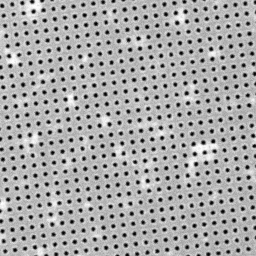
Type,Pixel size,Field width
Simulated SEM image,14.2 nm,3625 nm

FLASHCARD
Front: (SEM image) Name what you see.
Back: a regular array of holes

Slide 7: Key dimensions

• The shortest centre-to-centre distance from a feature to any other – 0.139 microns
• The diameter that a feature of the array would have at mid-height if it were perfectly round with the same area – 67.8 nanometers